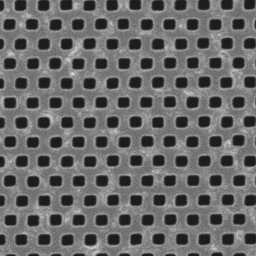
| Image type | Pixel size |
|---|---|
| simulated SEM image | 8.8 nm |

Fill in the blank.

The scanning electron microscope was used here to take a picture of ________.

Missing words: a regular array of holes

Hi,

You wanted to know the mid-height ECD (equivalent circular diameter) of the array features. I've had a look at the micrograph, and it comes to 109 nm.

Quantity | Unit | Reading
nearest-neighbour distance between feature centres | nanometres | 194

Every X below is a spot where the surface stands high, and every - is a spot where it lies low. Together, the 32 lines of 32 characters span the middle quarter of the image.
XX---XXX---XX---XXX---XXX---XXX-
XXXXXXXXXXXXXXXXXXXXXXXXXXXXXXXX
XXXXXXXXXXXXXXXXXXXXXXXXXXXXXXXX
XXXXXXXXXXX--XXXX--XXX---XXX---X
--XXX---XX----XX---XXX---XXX---X
--XXX---XX----XX---XXX---XXX---X
XXXXXXXXXXXXXXXXXXXXXXXXXXXXXXXX
XXXXXXXXXXXXXXXXXXXXXXXXXXXXXXXX
XX---XXX---XXX--XXX---XXX---XXX-
XX---XXX---XX----XX---XXX---XXX-
XX---XXX---XX---XXX---XXX---XXX-
XXXXXXXXXXXXXXXXXXXXXXXXXXXXXXXX
XXXXXXXXXXXXXXXXXXXXXXXXXXXXXXXX
--XXX---XXX---XXX--XXX---XXX---X
--XXX---XXX---XX----XX---XXX---X
--XXX---XXX---XXX--XXX---XXX---X
XXXXXXXXXXXXXXXXXXXXXXXXXXXXXXXX
XXXXXXXXXXXXXXXXXXXXXXXXXXXXXXXX
XX---XXX---XXX--XXXX--XXX---XXX-
XX---XXX---XXX---XX---XXX---XXX-
XX---XXX---XXX--XXXX--XXX---XXX-
XXXXXXXXXXXXXXXXXXXXXXXXXXXXXXXX
XXXXXXXXXXXXXXXXXXXXXXXXXXXXXXXX
--XXX---XXX---XXX---XX---XXX---X
--XXX---XXX---XXX---XX---XXX---X
--XXX---XXX--XXXX--XXXX-XXXX--XX
XXXXXXXXXXXXXXXXXXXXXXXXXXXXXXXX
XXXXXXXXXXXXXXXXXXXXXXXXXXXXXXXX
XX---XXX---XXX---XX---XXX---XXX-
XX---XXX---XXX---XX---XXX---XXX-
XXX--XXX---XXX--XXXX--XXXX-XXXXX
XXXXXXXXXXXXXXXXXXXXXXXXXXXXXXXX